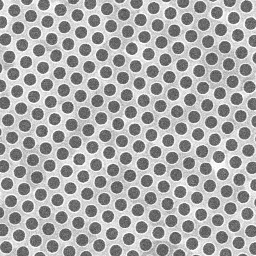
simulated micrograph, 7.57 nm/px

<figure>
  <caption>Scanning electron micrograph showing a regular array of holes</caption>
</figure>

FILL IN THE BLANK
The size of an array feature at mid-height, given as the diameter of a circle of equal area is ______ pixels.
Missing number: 13.2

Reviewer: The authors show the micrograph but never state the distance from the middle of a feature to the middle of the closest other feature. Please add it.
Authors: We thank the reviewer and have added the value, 131 nm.